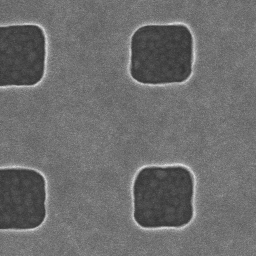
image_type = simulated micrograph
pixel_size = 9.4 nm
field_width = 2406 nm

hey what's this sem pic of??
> holes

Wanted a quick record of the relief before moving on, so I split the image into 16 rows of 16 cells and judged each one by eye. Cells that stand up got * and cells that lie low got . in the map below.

****************
****************
...*****....****
...*****....****
...*****....****
****************
****************
****************
****************
****************
*********..*****
...*****....****
...*****....****
...*****....****
****************
****************